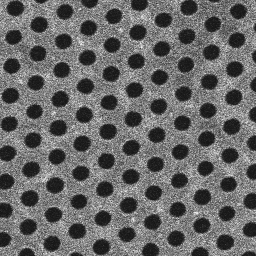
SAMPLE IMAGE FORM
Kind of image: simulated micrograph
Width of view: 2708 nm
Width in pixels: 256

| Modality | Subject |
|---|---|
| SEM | a regular array of holes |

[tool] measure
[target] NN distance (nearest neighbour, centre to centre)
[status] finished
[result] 0.298 µm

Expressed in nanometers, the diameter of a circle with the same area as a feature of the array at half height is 171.